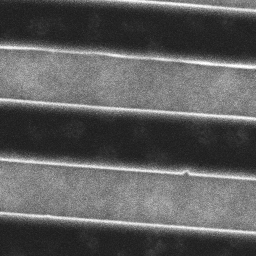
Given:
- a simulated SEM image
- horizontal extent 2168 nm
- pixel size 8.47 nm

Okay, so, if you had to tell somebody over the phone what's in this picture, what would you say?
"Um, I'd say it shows one or a few lines or trenches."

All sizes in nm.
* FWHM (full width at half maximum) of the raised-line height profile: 511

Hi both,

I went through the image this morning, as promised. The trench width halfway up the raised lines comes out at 0.446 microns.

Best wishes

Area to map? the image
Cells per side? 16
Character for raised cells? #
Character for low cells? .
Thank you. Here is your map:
###############.
################
################
.......#########
................
................
####............
################
################
################
.......#########
................
................
###.............
################
################